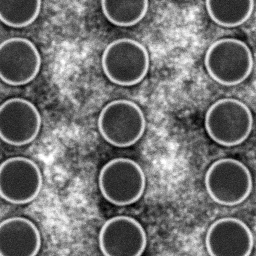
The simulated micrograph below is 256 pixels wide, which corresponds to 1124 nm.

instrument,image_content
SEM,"raised bodies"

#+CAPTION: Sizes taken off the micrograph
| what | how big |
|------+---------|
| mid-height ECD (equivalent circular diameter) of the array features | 0.198 microns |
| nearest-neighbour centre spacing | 264 nanometres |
